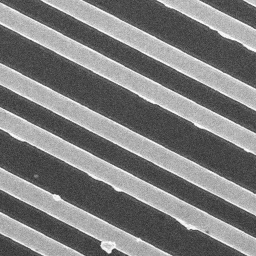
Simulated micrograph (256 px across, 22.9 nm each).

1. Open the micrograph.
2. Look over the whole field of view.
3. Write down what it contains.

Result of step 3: lines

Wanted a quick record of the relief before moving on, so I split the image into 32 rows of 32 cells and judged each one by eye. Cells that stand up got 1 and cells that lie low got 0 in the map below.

00000011111000000000011111000001
11000000111110000000000111110000
11110000001111100000000001111100
01111100000011111000000000011111
00011111000000111110000000001111
00000111110000001111100000000011
00000001111100000011111000000000
00000000011111000000111110000000
10000000000111110000001111100000
11100000000001111100000011111000
11111000000000011111000000111110
00111110000000000111110000001111
00001111100000000001111100000011
00000011111000000000111111000001
11000000111110000000001111110000
11110000001111100000000011111000
01111100000011111000000000111111
00011111000000111110000000001111
00000111110000011111100000000011
00000001111100000111111000000000
00000000011111000001111110000000
10000000000111110000011111100000
11100000000001111100000111110000
11111000000000111111000001111100
00111110000000000111110000011111
00001111100000000011111100000111
00000011111000000000111111000001
11000001111110000000001111100000
11110000011111100000000111111000
01111100000111111000000000111110
00011111000001111110000000001111
00000111110000011111100000000011